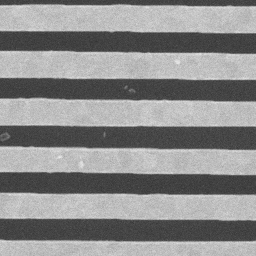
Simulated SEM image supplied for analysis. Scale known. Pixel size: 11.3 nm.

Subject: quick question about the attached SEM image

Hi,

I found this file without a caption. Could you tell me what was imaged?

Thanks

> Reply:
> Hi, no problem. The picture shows lines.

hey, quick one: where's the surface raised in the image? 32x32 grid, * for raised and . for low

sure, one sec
................................
********************************
********************************
********************************
................................
................................
**********......................
********************************
********************************
********************************
................................
................................
*******.........................
********************************
********************************
********************************
................................
................................
*******.........................
********************************
********************************
......*...**********************
................................
................................
********************************
********************************
********************************
...........................*****
................................
................................
********************************
********************************